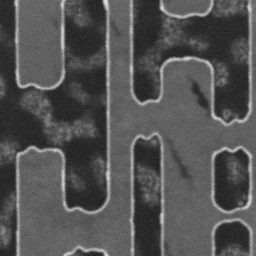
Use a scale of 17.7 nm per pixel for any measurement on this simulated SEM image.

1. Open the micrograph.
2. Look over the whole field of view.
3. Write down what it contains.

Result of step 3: one or a few lines or trenches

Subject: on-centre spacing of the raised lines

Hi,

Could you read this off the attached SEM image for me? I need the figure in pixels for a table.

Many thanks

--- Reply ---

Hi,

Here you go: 75.6